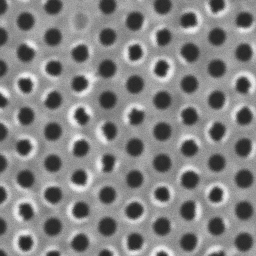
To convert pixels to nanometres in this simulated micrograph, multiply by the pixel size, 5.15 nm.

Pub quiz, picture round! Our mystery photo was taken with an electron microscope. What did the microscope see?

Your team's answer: a regular array of holes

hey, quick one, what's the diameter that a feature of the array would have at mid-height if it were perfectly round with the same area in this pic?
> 94.5 nm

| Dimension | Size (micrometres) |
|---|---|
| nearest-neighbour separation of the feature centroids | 0.16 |